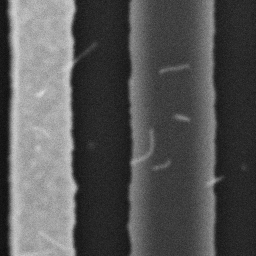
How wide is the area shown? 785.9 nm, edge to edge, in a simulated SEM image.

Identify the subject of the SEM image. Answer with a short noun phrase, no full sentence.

lines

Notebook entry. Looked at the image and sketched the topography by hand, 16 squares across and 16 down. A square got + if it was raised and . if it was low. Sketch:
.++++...+++++...
.+++....+++++...
.++++...+++++...
.++++...+++++...
.+++....+++++...
.+++....+++++...
.+++....+++++...
.+++....+++++...
.+++....+++++...
.+++....+++++...
.+++....+++++...
.++++...+++++...
.++++...+++++...
.++++...+++++...
.++++...+++++...
.++++...+++++...